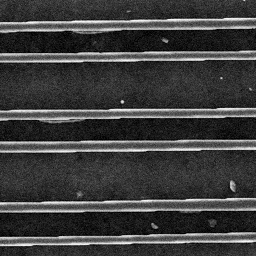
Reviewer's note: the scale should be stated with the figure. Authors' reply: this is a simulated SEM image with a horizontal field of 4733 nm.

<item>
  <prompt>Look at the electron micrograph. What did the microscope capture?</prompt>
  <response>lines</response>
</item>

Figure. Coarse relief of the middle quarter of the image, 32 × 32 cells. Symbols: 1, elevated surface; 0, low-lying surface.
00000000000000000000000000000000
00000000000000000000000000000000
00000000000000000000000000000000
00000000000000000000000000000000
00000000000000000000000000000000
00000000000000000000000000000000
00000000000000000000000000000000
00000000000000000000000000000000
00000000000000000000000000000000
00000000000000000000000000000000
00000000000000000000000000000000
00000000000011111111111111111111
11111111111111111111111111111111
11111111111111000000000000000000
00000000000000000000000000000000
00000000000000000000000000000000
00000000000000000000000000000000
00000000000000000000000000000000
00000000000000000000000000000000
00000111111111111111111111111111
11111111111111111111111111111111
11111111111111111111111111111111
00000000000000000000000000000000
00000000000000000000000000000000
00000000000000000000000000000000
00000000000000000000000000000000
00000000000000000000000000000000
00000000000000000000000000000000
00000000000000000000000000000000
00000000000000000000000000000000
00000000000000000000000000000000
00000000000000000000000000000000